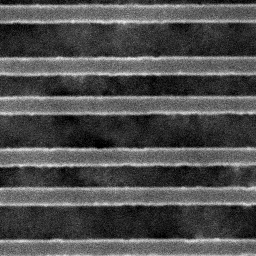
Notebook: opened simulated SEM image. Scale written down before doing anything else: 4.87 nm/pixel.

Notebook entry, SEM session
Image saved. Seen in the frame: lines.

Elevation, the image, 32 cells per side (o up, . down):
................................
oooooooooooooooooooooooooooooooo
oooooooooooooooooooooooooooooooo
................................
................................
................................
................................
oooooooooooooooooooooooooooooooo
oooooooooooooooooooooooooooooooo
................................
................................
................................
oooooooooooooooooooooooooooooooo
oooooooooooooooooooooooooooooooo
................................
................................
................................
................................
...............................o
oooooooooooooooooooooooooooooooo
oooooooooooooooooooooooooooooooo
................................
................................
...............o......o.oo..oooo
oooooooooooooooooooooooooooooooo
ooooooooooooooooo.ooo.oo......oo
................................
................................
................................
................................
oooooooooooooooooooooooooooooooo
oooooooooooooooooooooooooooooooo